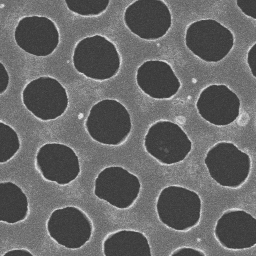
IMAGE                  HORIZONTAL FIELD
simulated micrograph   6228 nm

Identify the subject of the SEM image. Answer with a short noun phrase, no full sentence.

a regular array of holes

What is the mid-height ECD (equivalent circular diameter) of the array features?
1.05 µm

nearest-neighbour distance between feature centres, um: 1.53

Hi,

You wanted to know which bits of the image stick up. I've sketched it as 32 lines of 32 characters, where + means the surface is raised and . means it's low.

++++++++......++.....+++++++++..
+++++++++....+++.....+++++++++..
+++...++++++++++.....++++..+++++
++.....+++++++++.....+++....++++
++.....+++++.++++...+++......+++
++.....+++....+++++++++......+++
+++...+++......+++++++++.....++.
+++++++++......++++++++++...+++.
.++++++++......++....++++++++++.
.++++++++++...+++.....++++++++++
.+++....+++++++++.....++++++++++
+++.....++++++++++....+++....+++
+++.....+++++.+++++++++++.....++
+++.....++++....+++++++++.....++
+++++..++++.....+++++++++.....++
.++++++++++.....+++...+++++..+++
..+++++++++.....++.....+++++++++
..++++++++++...+++......++++++++
..+++....+++++++++......+++...++
..+++.....+++++++++....+++.....+
+++++.....++++++++++++++++.....+
+++++.....+++...++++++++++.....+
++++++...+++.....++++++++++....+
..++++++++++.....++++..+++++++++
...+++++++++.....+++.....+++++++
...+++++++++++..++++.....+++++++
...++++...++++++++++.....++++..+
...+++.....+++++++++.....++.....
++++++.....++++++++++...+++.....
++++++.....+++....+++++++++.....
+++++++....++......+++++++++....
+...+++++++++......+++...+++++++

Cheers